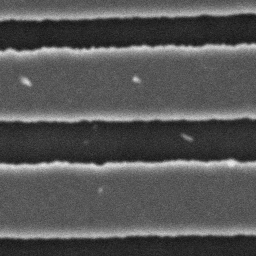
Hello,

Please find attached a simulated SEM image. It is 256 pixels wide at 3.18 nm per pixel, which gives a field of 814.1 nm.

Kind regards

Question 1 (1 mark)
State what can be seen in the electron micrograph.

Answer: lines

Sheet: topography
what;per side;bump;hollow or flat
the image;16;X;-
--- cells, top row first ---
XXXXXXXXXXXXXXXX
----------------
----------------
XXXXXXXXXXXXXXXX
XXXXXXXXXXXXXXXX
XXXXXXXXXXXXXXXX
XXXXXXXXXXXXXXXX
XXXXX-XXX-------
----------------
----------------
XXXXXXXXXXXXXXXX
XXXXXXXXXXXXXXXX
XXXXXXXXXXXXXXXX
XXXXXXXXXXXXXXXX
XXXXXXXXXXXXXXXX
----------------